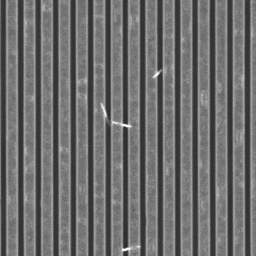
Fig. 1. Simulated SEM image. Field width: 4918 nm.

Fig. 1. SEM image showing parallel lines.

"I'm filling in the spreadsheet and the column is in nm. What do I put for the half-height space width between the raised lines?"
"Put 110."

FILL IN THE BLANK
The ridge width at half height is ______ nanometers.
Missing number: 219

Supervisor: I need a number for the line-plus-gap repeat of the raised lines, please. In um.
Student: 0.335